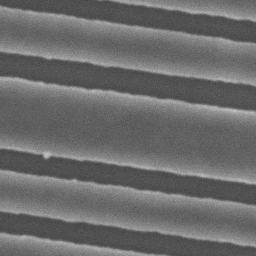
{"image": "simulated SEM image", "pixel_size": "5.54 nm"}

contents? lines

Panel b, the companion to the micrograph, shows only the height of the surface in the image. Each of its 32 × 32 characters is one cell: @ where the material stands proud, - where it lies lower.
-----------------@@@@@@@@@@@@@@@
@@@@-------------------@@@@@@@@@
@@@@@@@@@@@--------------------@
@@@@@@@@@@@@@@@@@@--------------
@@@@@@@@@@@@@@@@@@@@@@@@@-------
@@@@@@@@@@@@@@@@@@@@@@@@@@@@@@@@
-@@@@@@@@@@@@@@@@@@@@@@@@@@@@@@@
---------@@@@@@@@@@@@@@@@@@@@@@@
---------------@@@@@@@@@@@@@@@@@
-----------------------@@@@@@@@@
@@@@@@-------------------------@
@@@@@@@@@@@@@@------------------
@@@@@@@@@@@@@@@@@@@@@@----------
@@@@@@@@@@@@@@@@@@@@@@@@@@@@----
@@@@@@@@@@@@@@@@@@@@@@@@@@@@@@@@
@@@@@@@@@@@@@@@@@@@@@@@@@@@@@@@@
@@@@@@@@@@@@@@@@@@@@@@@@@@@@@@@@
@@@@@@@@@@@@@@@@@@@@@@@@@@@@@@@@
-@@@@@@@@@@@@@@@@@@@@@@@@@@@@@@@
-------@@@@@@@@@@@@@@@@@@@@@@@@@
--------------@@@@@@@@@@@@@@@@@@
@--------------------@@@@@@@@@@@
@@@@@@@@@--------------------@@@
@@@@@@@@@@@@@@@@----------------
@@@@@@@@@@@@@@@@@@@@@@@---------
@@@@@@@@@@@@@@@@@@@@@@@@@@@@@@--
-@@@@@@@@@@@@@@@@@@@@@@@@@@@@@@@
--------@@@@@@@@@@@@@@@@@@@@@@@@
----------------@@@@@@@@@@@@@@@@
@@@--------------------@@@@@@@@@
@@@@@@@@@--------------------@@@
@@@@@@@@@@@@@@@@@---------------